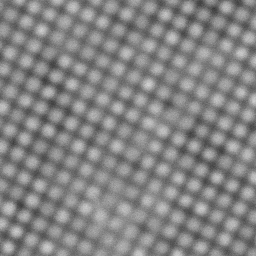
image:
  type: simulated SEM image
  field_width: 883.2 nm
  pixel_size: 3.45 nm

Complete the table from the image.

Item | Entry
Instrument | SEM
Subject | a regular array of raised bodies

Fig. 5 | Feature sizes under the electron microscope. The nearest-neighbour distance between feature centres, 0.0586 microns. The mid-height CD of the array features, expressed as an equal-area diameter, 44.8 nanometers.